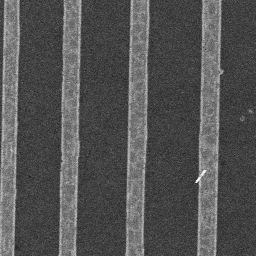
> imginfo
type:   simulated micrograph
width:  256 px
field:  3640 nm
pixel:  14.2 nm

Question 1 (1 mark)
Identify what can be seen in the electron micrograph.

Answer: one or a few lines or trenches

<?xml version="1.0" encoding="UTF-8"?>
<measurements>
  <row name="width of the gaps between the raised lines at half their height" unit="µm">0.732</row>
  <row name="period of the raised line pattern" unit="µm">0.954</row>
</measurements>